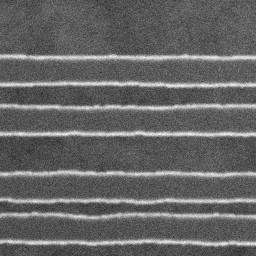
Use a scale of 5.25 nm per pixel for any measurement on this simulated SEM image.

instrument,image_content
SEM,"lines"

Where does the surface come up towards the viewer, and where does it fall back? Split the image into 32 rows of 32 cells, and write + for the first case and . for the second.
................................
................................
................................
................................
................................
................................
................................
++++++++++++++++++++++++++++++++
++++++++++++++++++++++++++++++++
++++++++++++++++++++++++++++++++
++++++++.++++.++++++++++++++++++
................................
................................
++++++++++++++++++++++++++++++++
++++++++++++++++++++++++++++++++
++++++++++++++++++++++++++++++++
++++++++++++++++++++++++++++++++
................................
................................
................................
................................
.......+........................
++++++++++++++++++++++++++++++++
++++++++++++++++++++++++++++++++
++++++++++++++++++++++++++++++++
................................
................................
++++++++++++++++++++++++++++++++
++++++++++++++++++++++++++++++++
++++++++++++++++++++++++++++++++
.........................+++...+
................................